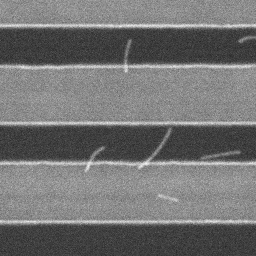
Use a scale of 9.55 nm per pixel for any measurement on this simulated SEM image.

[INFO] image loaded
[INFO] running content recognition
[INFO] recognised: lines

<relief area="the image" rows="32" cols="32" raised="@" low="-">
--------------------------------
--------------------------------
--------------------------------
@@@@@@@@@@@@@@@@@@@@@@@@@@@@@@@@
@@@@@@@@@@@@@@@@@@@@@@@@@@@@@@@@
@@@@@@@@@@@@@@@@@@@@@@@@@@@@@@@@
@@@@@@@@@@@@@@@@@@@@@@@@@@@@@@@@
@@@@@@@@@@@@@@@@@@@@@@@@@@@@@@@@
---------------@----------------
--------------------------------
--------------------------------
--------------------------------
--------------------------------
--------------------------------
--------------------------------
@@@@@@@@@@@@@@@@@@@@@@@@@@@@@@@@
@@@@@@@@@@@@@@@@@@@@@@@@@@@@@@@@
@@@@@@@@@@@@@@@@@@@@@@@@@@@@@@@@
@@@@@@@@@@@@@@@@@@@@@@@@@@@@@@@@
@@@@@@@@@@@@@@@@@@@@@@@@@@@@@@@@
----------@@-----@--------------
--------------------------------
--------------------------------
--------------------------------
--------------------------------
--------------------------------
--------------------------------
--------------------------------
@@@@@@@@@@@@@@@@@@@@@@@@@@@@@@@@
@@@@@@@@@@@@@@@@@@@@@@@@@@@@@@@@
@@@@@@@@@@@@@@@@@@@@@@@@@@@@@@@@
@@@@@@@@@@@@@@@@@@@@@@@@@@@@@@@@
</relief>